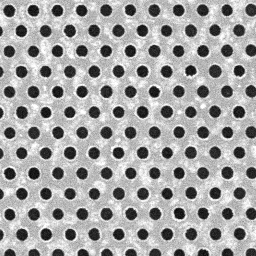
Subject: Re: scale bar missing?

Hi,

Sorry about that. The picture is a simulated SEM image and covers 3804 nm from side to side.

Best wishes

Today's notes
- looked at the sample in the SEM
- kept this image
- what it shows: a regular array of holes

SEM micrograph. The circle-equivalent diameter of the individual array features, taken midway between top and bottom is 0.188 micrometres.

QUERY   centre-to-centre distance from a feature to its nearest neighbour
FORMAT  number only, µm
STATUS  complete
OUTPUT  0.348